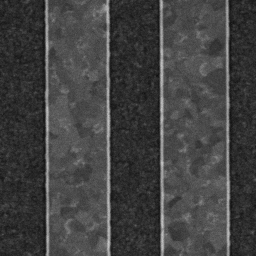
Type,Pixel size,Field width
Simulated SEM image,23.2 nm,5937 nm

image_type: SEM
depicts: one or a few lines or trenches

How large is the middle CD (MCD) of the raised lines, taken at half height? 1480 nm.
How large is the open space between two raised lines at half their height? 1230 nm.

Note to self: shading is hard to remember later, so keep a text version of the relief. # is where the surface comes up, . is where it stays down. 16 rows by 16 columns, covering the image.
...####...####..
...####...####..
...####...####..
...####...####..
...####...####..
...####...####..
...####...####..
...####...####..
...####...####..
...####...####..
...####...####..
...####...####..
...####...####..
...####...####..
...####...####..
...####...####..